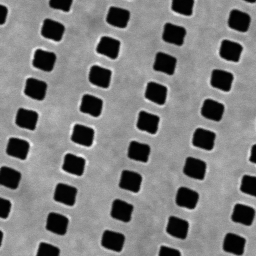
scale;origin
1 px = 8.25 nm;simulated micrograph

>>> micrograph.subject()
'a regular array of holes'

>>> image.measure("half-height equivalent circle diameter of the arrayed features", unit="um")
0.186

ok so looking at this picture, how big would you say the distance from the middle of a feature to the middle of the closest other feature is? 252 nm